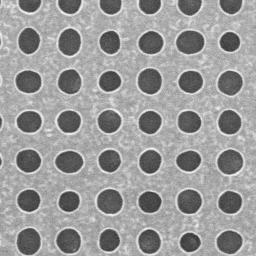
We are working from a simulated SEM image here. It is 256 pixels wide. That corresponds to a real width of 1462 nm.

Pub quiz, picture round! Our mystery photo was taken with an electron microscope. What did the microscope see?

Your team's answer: a regular array of holes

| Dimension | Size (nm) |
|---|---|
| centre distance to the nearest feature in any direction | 225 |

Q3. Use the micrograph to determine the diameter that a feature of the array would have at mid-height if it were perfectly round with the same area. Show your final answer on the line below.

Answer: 139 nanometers